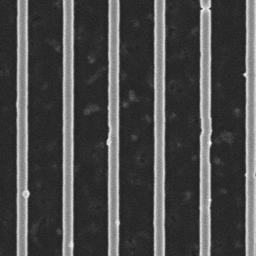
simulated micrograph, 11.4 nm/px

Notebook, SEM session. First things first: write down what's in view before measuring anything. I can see parallel lines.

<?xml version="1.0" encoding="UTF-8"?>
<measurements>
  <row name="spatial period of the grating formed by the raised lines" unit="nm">520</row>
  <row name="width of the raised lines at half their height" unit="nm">107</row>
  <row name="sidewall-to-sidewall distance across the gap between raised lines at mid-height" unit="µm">0.415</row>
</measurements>